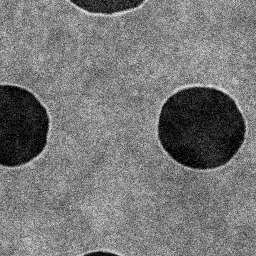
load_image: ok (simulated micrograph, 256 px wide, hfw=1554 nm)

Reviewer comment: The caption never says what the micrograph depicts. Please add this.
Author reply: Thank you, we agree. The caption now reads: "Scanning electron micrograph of holes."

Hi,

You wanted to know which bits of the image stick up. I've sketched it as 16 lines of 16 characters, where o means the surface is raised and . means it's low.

ooooo...oooooooo
oooooooooooooooo
oooooooooooooooo
oooooooooooooooo
oooooooooooooooo
.ooooooooooo.ooo
...ooooooo.....o
...ooooooo.....o
...ooooooo.....o
...ooooooo.....o
oooooooooooo..oo
oooooooooooooooo
oooooooooooooooo
oooooooooooooooo
oooooooooooooooo
oooooooooooooooo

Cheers